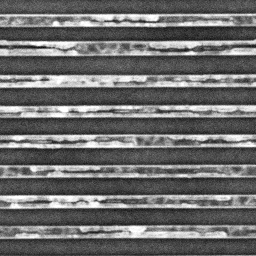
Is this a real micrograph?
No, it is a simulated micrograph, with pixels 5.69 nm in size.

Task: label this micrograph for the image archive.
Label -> parallel lines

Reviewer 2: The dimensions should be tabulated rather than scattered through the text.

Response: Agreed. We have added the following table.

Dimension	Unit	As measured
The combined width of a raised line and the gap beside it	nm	172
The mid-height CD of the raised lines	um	0.0647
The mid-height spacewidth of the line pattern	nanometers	107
